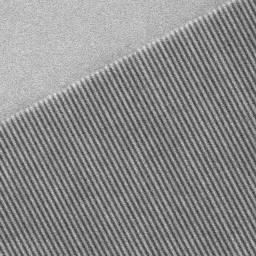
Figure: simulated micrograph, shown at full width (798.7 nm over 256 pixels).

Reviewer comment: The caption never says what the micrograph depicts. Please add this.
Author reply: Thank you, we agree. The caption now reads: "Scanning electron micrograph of parallel lines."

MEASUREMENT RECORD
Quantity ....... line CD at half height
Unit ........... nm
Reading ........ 8.6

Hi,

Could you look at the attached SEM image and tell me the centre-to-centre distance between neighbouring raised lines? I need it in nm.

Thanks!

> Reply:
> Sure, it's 16.5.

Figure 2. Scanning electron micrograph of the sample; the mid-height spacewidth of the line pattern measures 8.3 nanometres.